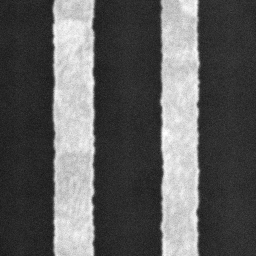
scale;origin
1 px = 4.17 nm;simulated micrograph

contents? lines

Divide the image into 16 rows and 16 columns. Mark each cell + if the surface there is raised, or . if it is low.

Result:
...+++....++....
...+++....++....
...+++....++....
...+++....++....
...+++....++....
...+++....++....
...+++....++....
...+++....++....
...+++....++....
...+++....++....
...+++....++....
...+++....++....
...+++....++....
...+++....++....
...+++....++....
...+++....++....